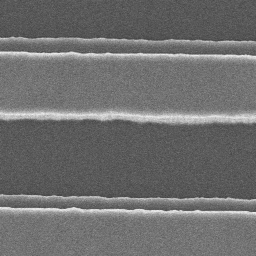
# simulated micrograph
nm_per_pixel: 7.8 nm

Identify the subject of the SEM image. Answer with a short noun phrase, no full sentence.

lines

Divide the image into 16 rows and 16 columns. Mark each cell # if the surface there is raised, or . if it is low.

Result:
................
................
########........
################
################
################
################
................
................
................
................
................
###############.
################
################
################